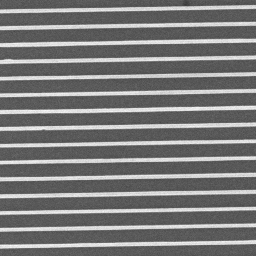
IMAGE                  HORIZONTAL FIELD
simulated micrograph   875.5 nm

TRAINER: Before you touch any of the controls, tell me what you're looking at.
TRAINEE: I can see parallel lines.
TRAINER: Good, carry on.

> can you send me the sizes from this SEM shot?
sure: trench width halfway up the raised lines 44.4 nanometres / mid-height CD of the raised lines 12.4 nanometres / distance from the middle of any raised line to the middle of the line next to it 0.0574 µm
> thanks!